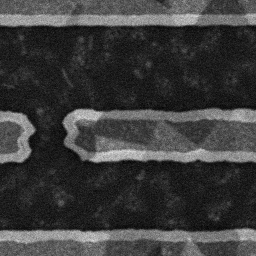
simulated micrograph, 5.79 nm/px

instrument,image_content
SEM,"one or a few lines or trenches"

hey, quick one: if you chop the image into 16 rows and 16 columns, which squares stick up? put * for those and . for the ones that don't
****************
................
................
................
................
................
................
*...************
**..************
*....***********
................
................
................
................
................
****************